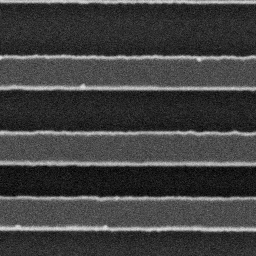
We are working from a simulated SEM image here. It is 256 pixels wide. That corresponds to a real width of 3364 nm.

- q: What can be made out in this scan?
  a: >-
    lines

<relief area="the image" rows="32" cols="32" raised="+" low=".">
................................
................................
................................
................................
................................
................................
................................
++++++++++++++++++++++++++++++++
++++++++++++++++++++++++++++++++
++++++++++++++++++++++++++++++++
++++++++++++++++++++++++++++++++
................................
................................
................................
................................
................................
+...+++................+.....+..
++++++++++++++++++++++++++++++++
++++++++++++++++++++++++++++++++
++++++++++++++++++++++++++++++++
.+++++++++++++++++++++++++++++++
................................
................................
................................
................................
++++++++++++++++++++++++++++++++
++++++++++++++++++++++++++++++++
++++++++++++++++++++++++++++++++
++++++++++++++++++++++++++++++++
................................
................................
................................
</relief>